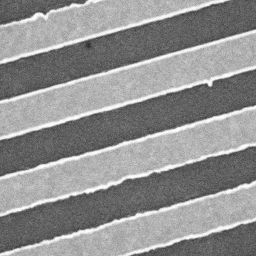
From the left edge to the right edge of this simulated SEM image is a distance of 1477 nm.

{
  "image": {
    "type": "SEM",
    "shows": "one or a few lines or trenches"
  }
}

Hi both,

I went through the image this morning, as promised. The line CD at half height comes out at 0.203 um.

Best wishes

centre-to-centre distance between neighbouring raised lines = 423 nm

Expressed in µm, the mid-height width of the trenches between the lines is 0.223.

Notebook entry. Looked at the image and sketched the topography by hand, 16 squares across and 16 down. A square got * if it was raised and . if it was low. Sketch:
....********....
*********.......
*****.........**
*.........******
.......********.
...********.....
********........
****.........***
*.........******
......********..
..*********.....
*******.........
***.........****
.........*******
.....********...
.********.......